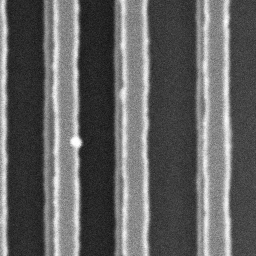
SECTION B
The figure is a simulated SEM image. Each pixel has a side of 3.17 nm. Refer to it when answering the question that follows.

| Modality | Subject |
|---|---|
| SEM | lines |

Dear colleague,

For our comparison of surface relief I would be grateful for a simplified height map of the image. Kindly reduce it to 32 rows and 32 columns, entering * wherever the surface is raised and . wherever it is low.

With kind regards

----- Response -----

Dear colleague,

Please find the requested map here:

*.....****....****.......***....
*.....****....****.......***....
*.....****....****.......***....
*.....****....****.......***....
*.....****....****.......***....
*.....****....****.......***....
*.....****....****.......***....
*.....****....****.......***....
*.....****....****.......***....
*.....****....****.......***....
*.....****....****.......***....
*.....****....****.......***....
*.....****.....***.......***....
*.....****.....***.......***....
*.....****....****.......***....
*.....****....****.......***....
*.....****....****.......****...
*.....****....****.......****...
*.....****.....***.......****...
*.....****.....***.......****...
*.....****.....***.......****...
*.....****....****.......****...
*.....****....****.......****...
*.....****....****.......****...
*.....****....****.......***....
*.....****....****.......***....
*.....****....****.......***....
*.....****.....***.......****...
*.....****.....***.......****...
*.....****.....***.......****...
*.....****.....***.......****...
*.....****....****.......****...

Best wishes